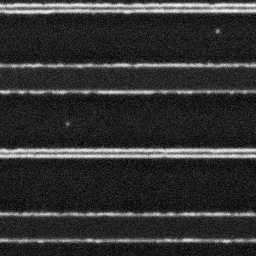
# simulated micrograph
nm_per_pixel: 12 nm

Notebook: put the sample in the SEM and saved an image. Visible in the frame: lines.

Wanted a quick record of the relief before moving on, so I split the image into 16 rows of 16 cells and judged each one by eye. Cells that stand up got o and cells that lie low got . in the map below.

.o..............
................
................
................
oooooooooooooooo
oooooooooooooooo
................
................
................
................
................
................
................
oooooooooooooooo
oooooooooooooooo
................